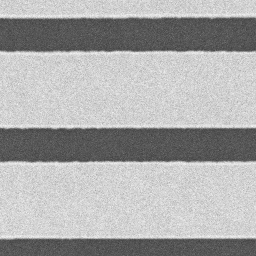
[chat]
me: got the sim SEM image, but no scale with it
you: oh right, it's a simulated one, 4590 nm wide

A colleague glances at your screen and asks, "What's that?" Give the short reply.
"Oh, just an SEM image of lines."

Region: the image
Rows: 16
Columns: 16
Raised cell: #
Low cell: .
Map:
################
................
................
################
################
################
################
################
................
................
################
################
################
################
################
................